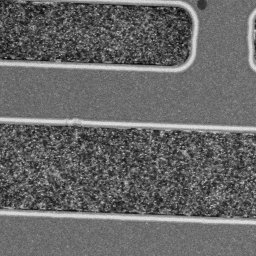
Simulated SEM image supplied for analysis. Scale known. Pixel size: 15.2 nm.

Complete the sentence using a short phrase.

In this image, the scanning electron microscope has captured one or a few lines or trenches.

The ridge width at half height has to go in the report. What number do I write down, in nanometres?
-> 848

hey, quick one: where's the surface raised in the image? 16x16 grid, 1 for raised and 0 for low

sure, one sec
0000000000001111
0000000000001111
0000000000001111
0000000000001111
1111111111111111
1111111111111111
1111111111111111
0111111111111111
0000000000000000
0000000000000000
0000000000000000
0000000000000000
0000000000000000
1111100000000000
1111111111111111
1111111111111111